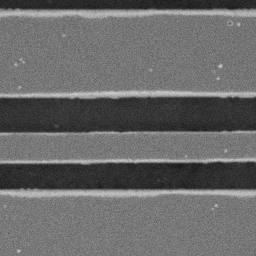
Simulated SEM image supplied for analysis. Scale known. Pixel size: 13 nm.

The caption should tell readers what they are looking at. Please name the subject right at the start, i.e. lines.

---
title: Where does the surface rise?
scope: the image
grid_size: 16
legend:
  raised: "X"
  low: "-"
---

----------------
XXXXXXXXXXXXXXXX
XXXXXXXXXXXXXXXX
XXXXXXXXXXXXXXXX
XXXXXXXXXXXXXXXX
XXXXXXXXXXXXXXXX
----------------
----------------
XXXXXXXXXXXXXXXX
XXXXXXXXXXXXXXXX
----------------
----------------
XXXXXXXXXXXXXXXX
XXXXXXXXXXXXXXXX
XXXXXXXXXXXXXXXX
XXXXXXXXXXXXXXXX